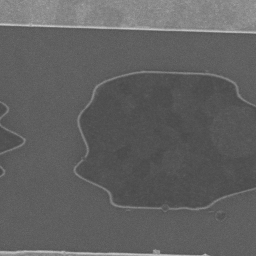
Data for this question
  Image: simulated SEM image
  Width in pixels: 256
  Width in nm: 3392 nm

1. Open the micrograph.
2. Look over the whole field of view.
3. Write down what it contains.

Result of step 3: one or a few lines or trenches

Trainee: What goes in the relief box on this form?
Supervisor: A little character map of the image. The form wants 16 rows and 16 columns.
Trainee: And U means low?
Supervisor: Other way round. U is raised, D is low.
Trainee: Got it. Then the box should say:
UUUUUUUUUUUUUUUU
UUUUUUUUUUUUUUUU
DDDDDDDDDDDDDDDD
DDDDDDDDDDDDDDDD
DDDDDDDDDUDDDDDD
DDDDDDUUUUUUUUUD
DDDDDDUUUUUUUUUU
DDDDDUUUUUUUUUUU
UDDDDUUUUUUUUUUU
DDDDDUUUUUUUUUUU
DDDDDUUUUUUUUUUU
DDDDDDUUUUUUUUUU
DDDDDDDUUUUUUUDD
DDDDDDDDDDDDDDDD
DDDDDDDDDDDDDDDD
DDDDDDDDDDDDDDDD